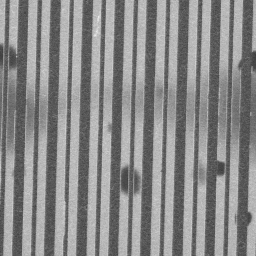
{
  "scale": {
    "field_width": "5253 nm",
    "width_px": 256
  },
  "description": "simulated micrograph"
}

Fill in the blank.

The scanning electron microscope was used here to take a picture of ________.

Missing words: parallel lines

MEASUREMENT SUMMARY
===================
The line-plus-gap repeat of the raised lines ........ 329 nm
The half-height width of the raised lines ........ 167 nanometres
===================